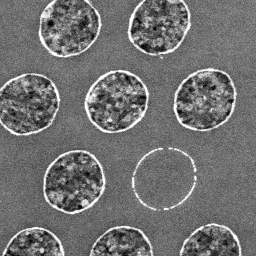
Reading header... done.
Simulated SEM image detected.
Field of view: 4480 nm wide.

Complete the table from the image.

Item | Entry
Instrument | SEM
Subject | raised bodies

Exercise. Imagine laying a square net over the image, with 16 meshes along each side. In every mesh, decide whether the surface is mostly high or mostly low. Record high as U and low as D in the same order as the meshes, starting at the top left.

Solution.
DDDUUUDDDUUUDDDD
DDDUUUDDUUUUDDDD
DDDUUUDDUUUDDDDD
DDDDDDDDDDDDDDDD
DDDDDDDUDDDDUUDD
UUUDDDUUUDDUUUUD
UUUUDUUUUDDUUUUD
UUUDDDUUUDDUUUDD
DDDDDDDDDDDDDDDD
DDDDDDDDDDDDDDDD
DDDUUUDDDDDDDDDD
DDDUUUDDDDDDDDDD
DDDUUUDDDDDDDDDD
DDDDDDDDDDDDDDDD
DUUDDDDUUDDDUUDD
UUUUDDUUUDDUUUUD